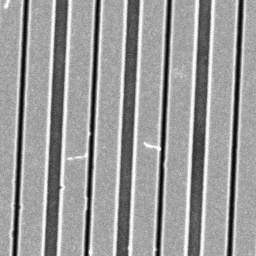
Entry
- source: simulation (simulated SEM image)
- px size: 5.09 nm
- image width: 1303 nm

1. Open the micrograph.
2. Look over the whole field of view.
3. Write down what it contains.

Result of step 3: parallel lines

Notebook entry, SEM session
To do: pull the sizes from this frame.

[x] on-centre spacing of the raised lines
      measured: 187 nm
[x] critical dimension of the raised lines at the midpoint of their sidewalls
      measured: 131 nm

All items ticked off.